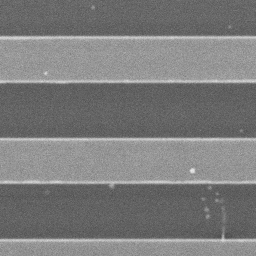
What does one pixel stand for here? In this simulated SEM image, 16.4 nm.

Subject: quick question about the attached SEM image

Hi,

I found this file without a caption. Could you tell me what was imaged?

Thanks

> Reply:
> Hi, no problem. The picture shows lines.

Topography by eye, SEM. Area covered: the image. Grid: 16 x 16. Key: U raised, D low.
DDDDDDDDDDDDDDDD
DDDDDDDDDDDDDDDD
UUUUUUUUUUUUUUUU
UUUUUUUUUUUUUUUU
UUUUUUUUUUUUUUUU
DDDDDDDDDDDDDDDD
DDDDDDDDDDDDDDDD
DDDDDDDDDDDDDDDD
DDDDDDDDDDDDDDDD
UUUUUUUUUUUUUUUU
UUUUUUUUUUUUUUUU
DDDDDDDDDDDDDDDD
DDDDDDDDDDDDDDDD
DDDDDDDDDDDDDDDD
DDDDDDDDDDDDDDDD
UUUUUUUUUUUUUUUU